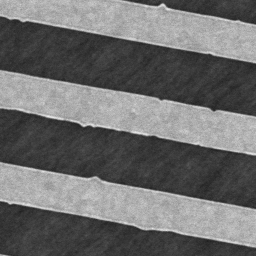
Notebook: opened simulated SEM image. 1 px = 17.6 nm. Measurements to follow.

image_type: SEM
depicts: one or a few lines or trenches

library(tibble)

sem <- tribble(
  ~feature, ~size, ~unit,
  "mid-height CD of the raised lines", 0.654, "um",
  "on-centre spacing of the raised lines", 1.6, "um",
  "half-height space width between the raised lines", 934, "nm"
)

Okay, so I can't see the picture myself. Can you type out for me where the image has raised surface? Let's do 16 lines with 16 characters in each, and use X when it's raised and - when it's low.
XXXXXXXXXXX-----
---XXXXXXXXXXXXX
--------XXXXXXXX
--------------XX
X---------------
XXXXXX----------
XXXXXXXXXXX-----
----XXXXXXXXXXXX
----------XXXXXX
---------------X
XX--------------
XXXXXXX---------
XXXXXXXXXXXXX---
-----XXXXXXXXXXX
-----------XXXXX
----------------